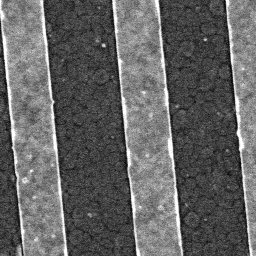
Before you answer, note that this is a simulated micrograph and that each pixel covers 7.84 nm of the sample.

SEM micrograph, one or a few lines or trenches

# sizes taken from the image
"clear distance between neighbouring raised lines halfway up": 69.3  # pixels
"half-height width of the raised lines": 0.346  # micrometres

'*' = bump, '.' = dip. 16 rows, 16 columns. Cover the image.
***....***....**
***....***....**
***....***....**
***....***....**
***....***.....*
.**.....**.....*
.**.....**.....*
.**.....***....*
.**.....***....*
.***....***....*
.***....***....*
.***....***....*
.***....***....*
.***....***....*
.***....***....*
.***.....**.....